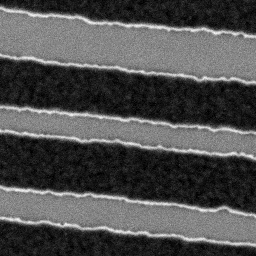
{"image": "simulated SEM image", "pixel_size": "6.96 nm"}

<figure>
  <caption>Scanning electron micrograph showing one or a few lines or trenches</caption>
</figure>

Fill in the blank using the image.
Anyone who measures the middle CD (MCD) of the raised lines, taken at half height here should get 366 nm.